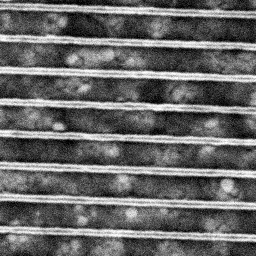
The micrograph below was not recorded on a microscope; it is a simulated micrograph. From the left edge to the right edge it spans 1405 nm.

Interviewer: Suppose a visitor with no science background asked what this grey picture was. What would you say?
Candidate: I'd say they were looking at parallel lines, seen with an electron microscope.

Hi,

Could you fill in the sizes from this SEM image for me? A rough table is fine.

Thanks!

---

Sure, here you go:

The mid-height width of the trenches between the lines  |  0.145 um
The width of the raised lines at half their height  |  30.9 nm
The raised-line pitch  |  175 nanometres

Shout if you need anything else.